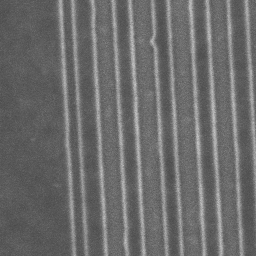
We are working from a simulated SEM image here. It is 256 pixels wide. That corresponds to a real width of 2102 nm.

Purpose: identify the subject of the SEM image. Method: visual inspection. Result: parallel lines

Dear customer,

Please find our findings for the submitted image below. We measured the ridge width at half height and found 149 nanometres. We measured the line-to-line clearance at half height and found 163 nanometres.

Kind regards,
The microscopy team